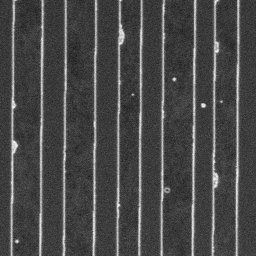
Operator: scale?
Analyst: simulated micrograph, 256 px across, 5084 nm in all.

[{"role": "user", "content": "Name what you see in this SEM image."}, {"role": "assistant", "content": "lines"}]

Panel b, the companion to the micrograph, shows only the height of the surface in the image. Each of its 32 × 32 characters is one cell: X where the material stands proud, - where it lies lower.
XX---XXX----XXX---XX----XXX---XX
XX---XXX----XXX---XX----XXX---XX
XX---XXX----XXX---XX----XXX---XX
XX---XXX----XXX---XX----XXX---XX
XX---XXX----XXX---XX----XXX---XX
XX---XXX----XXX---XX----XXX---XX
XX---XXX----XXX---XX----XXX---XX
XX---XXX----XXX---XX----XXX---XX
XX---XXX----XXX---XX----XXX---XX
XX---XXX----XXX---XX----XXX---XX
XX---XXX----XXX---XX----XXX---XX
XX---XXX----XXX---XX----XXX---XX
XX---XXX----XXX---XX----XXX---XX
XX---XXX----XXX---XX----XXX---XX
XX---XXX----XXX---XX----XXX---XX
XX---XXX----XXX---XX----XXX---XX
XX---XXX----XXX---XX----XXX---XX
XX---XXX----XXX---XX----XXX---XX
XX---XXX----XXX---XX----XXX---XX
XX---XXX----XXX---XX----XXX---XX
XX---XXX----XXX---XX----XXX---XX
XX---XXX----XXX---XX----XXX---XX
XX---XXX----XXX---XX----XXX---XX
XX---XXX----XXX---XX----XXX---XX
XX---XXX----XXX---XX----XXX---XX
XX---XXX----XXX---XX----XXX---XX
X----XXX----XXX--XXX----XXX---XX
X----XXX----XXX--XXX----XXX---XX
X----XXX----XXX--XXX----XXX---XX
X----XXX----XXX--XXX----XXX---XX
X----XXX----XXX--XXX----XXX---XX
X----XXX----XXX--XXX----XXX---XX